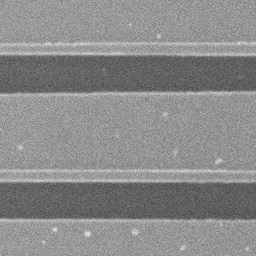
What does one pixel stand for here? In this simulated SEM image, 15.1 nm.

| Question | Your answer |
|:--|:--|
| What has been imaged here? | lines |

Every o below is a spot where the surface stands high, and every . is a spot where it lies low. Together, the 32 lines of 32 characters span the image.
oooooooooooooooooooooooooooooooo
oooooooooooooooooooooooooooooooo
oooooooooooooooooooooooooooooooo
oooooooooooooooooooooooooooooooo
oooooooooooooooooooooooooooooooo
oooooooooooooooooooooooooooooooo
oooooooooooooooooooooooooooooooo
................................
................................
................................
................................
................................
oooooooooooooooooooooooooooooooo
oooooooooooooooooooooooooooooooo
oooooooooooooooooooooooooooooooo
oooooooooooooooooooooooooooooooo
oooooooooooooooooooooooooooooooo
oooooooooooooooooooooooooooooooo
oooooooooooooooooooooooooooooooo
oooooooooooooooooooooooooooooooo
oooooooooooooooooooooooooooooooo
oooooooooooooooooooooooooooooooo
oooooooooooooooooooooooooooooooo
................................
................................
................................
................................
oooo.o.....o..o...........o.....
oooooooooooooooooooooooooooooooo
oooooooooooooooooooooooooooooooo
oooooooooooooooooooooooooooooooo
oooooooooooooooooooooooooooooooo